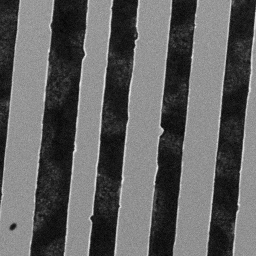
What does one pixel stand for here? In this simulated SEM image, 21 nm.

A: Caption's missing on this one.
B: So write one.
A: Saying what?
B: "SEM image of parallel lines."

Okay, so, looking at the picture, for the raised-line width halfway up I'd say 692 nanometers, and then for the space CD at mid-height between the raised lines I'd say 554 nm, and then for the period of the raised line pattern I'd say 1.23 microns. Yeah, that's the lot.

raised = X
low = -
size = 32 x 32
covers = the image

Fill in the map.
--XXXXX----XXX---XXXX----XXXX---
--XXXXX----XXX---XXXX----XXXX---
--XXXX-----XXX---XXXX---XXXXX---
--XXXX-----XXX---XXXX---XXXXX---
--XXXX-----XXX---XXXX---XXXXX---
--XXXX-----XXX---XXXX---XXXX----
--XXXX-----XX----XXXX---XXXX---X
--XXXX----XXX----XXXX---XXXX---X
--XXXX----XXX----XXXX---XXXX---X
--XXXX----XXX----XXXX---XXXX---X
--XXXX----XXX---XXXX----XXXX---X
-XXXXX----XXX---XXXX----XXXX---X
-XXXXX----XXX---XXXX----XXXX---X
-XXXX-----XXX---XXXX---XXXXX---X
-XXXX-----XXX---XXXX---XXXXX---X
-XXXX-----XXX---XXXX---XXXX----X
-XXXX-----XX----XXXX---XXXX----X
-XXXX----XXX----XXXX---XXXX----X
-XXXX----XXX----XXXX---XXXX---XX
-XXXX----XXX----XXXX---XXXX---XX
-XXXX----XXX---XXXXX---XXXX---XX
XXXXX----XXX---XXXXX---XXXX---XX
XXXXX----XXX---XXXX----XXXX---XX
XXXX-----XXX---XXXX----XXXX---XX
XXXX-----XXX---XXXX---XXXXX---XX
XXXX-----XXX---XXXX---XXXX----XX
XXXX-----XXX---XXXX---XXXX----XX
XXXX----XXX----XXXX---XXXX----XX
XXXX----XXX----XXXX---XXXX---XXX
XXXX----XXX----XXXX---XXXX---XXX
XXXX----XXX----XXXX---XXXX---XXX
XXXX----XXX---XXXXX---XXXX---XXX